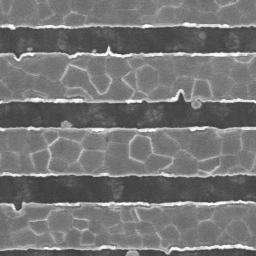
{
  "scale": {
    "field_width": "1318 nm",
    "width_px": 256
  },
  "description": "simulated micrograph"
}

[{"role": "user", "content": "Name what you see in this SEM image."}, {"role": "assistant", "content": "one or a few lines or trenches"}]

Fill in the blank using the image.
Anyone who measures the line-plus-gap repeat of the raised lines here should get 73.8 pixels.